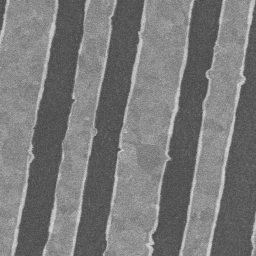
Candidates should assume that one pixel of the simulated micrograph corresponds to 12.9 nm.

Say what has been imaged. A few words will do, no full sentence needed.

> one or a few lines or trenches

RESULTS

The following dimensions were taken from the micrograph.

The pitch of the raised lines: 67.3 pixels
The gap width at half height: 397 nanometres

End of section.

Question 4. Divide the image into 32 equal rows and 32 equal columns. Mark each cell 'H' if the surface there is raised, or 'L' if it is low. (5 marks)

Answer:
LHHHHHHLLLLHHHLLLLHHHHHHLLLLHHHH
LHHHHHHLLLLHHHLLLLHHHHHHLLLLHHHL
LHHHHHHLLLHHHHLLLLHHHHHHLLLLHHHL
HHHHHHHLLLHHHHLLLLHHHHHHLLLHHHHL
HHHHHHLLLLHHHHLLLHHHHHHLLLLHHHHL
HHHHHHLLLLHHHHLLLLHHHHHLLLLHHHHL
HHHHHHLLLLHHHLLLLHHHHHHLLLLHHHHL
HHHHHHLLLLHHHLLLLHHHHHHLLLLHHHLL
HHHHHHLLLLHHHLLLLHHHHHHLLLHHHHLL
HHHHHLLLLLHHHLLLLHHHHHHLLLHHHHLL
HHHHHLLLLHHHHLLLLHHHHHHLLLHHHHLL
HHHHHLLLLHHHLLLLHHHHHHLLLLHHHHLL
HHHHHLLLLHHHLLLLHHHHHHLLLLHHHHLL
HHHHHLLLLHHHLLLLHHHHHHLLLLHHHLLL
HHHHLLLLLHHHLLLLHHHHHHLLLHHHHLLL
HHHHLLLLLHHHLLLHHHHHHLLLLHHHHLLL
HHHHLLLLHHHHLLLHHHHHHLLLLHHHHLLL
HHHHLLLLHHHLLLLHHHHHHLLLLHHHHLLL
HHHHLLLLHHHLLLLHHHHHHLLLLHHHHLLL
HHHHLLLLHHHLLLLHHHHHHLLLLHHHLLLL
HHHHLLLLHHHLLLLHHHHHHLLLLHHHLLLL
HHHLLLLHHHHLLLLHHHHHLLLLLHHHLLLL
HHHLLLLHHHHLLLHHHHHHLLLLHHHHLLLL
HHHLLLLHHHLLLLHHHHHHLLLLHHHHLLLL
HHHLLLLHHHLLLLHHHHHHLLLLHHHLLLLL
HHHLLLLHHHLLLLHHHHHHLLLLHHHLLLLL
HHHLLLLHHHLLLLHHHHHHLLLLHHHLLLLL
HHLLLLLHHHLLLLHHHHHHLLLHHHHLLLLL
HHLLLLHHHHLLLLHHHHHLLLLHHHHLLLLL
HHLLLLHHHLLLLHHHHHHLLLLHHHLLLLLL
HHLLLLHHHLLLLHHHHHHLLLLHHHLLLLLL
HHLLLLHHHLLLLHHHHHHLLLLHHHLLLLLL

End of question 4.